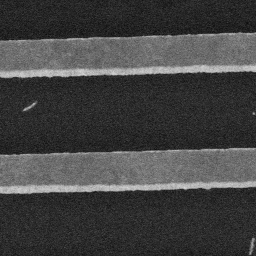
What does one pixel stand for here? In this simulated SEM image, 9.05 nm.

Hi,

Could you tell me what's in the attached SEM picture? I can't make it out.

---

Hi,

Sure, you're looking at lines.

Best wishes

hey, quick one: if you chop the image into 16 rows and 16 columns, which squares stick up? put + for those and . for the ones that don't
................
................
..++++++++++++++
++++++++++++++++
+++++++++.......
................
................
................
................
.........+++++++
++++++++++++++++
++++++++++++++++
................
................
................
................